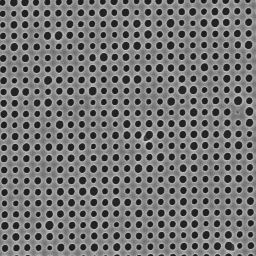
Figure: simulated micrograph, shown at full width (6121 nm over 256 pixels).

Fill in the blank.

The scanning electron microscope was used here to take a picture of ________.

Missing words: a regular array of holes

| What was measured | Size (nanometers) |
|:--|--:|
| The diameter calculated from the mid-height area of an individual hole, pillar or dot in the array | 160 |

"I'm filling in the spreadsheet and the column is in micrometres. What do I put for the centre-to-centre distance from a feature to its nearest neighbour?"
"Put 0.258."